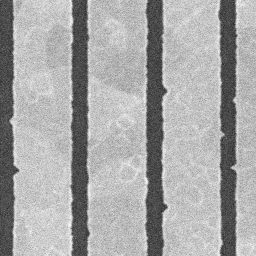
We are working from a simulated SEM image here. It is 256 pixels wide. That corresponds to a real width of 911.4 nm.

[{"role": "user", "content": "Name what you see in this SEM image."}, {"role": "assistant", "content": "one or a few lines or trenches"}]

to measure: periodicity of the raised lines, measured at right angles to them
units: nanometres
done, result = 265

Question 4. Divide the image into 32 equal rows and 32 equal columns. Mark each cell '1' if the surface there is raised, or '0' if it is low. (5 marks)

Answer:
00111111100111111100011111100011
00111111100111111100011111100011
00111111100111111100011111100011
00111111100111111100011111100011
00111111100111111100111111100011
00111111100111111100111111100011
00111111100111111100111111100011
00111111100111111100111111110011
00111111100111111100111111100011
00111111100111111100111111100011
00111111100111111100111111110011
00111111100111111100011111110011
00111111100111111100111111100111
00111111100111111100111111100011
00111111100111111100111111100011
01111111100111111100011111110011
00111111100111111100111111110011
00111111100111111100111111110011
00111111100111111100111111100011
00111111100111111100111111100011
00111111100111111100111111100111
00111111100111111100111111100111
00111111100111111100111111100011
00111111100111111100111111100011
00111111100111111100011111100011
00111111100111111100011111100011
00111111100111111100011111110011
00111111100111111100111111110011
00111111100111111100111111110011
00111111100111111100011111110011
00111111100111111100011111110011
00111111100111111100111111100011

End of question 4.